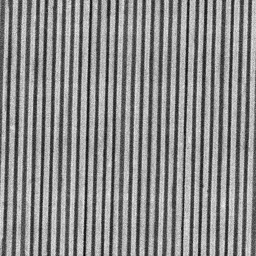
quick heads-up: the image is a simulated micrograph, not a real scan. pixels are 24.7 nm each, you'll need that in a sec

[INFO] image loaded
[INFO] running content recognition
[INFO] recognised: parallel lines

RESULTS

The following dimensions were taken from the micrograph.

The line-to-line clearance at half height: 111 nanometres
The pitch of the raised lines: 218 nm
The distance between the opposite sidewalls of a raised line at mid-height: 4.5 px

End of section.